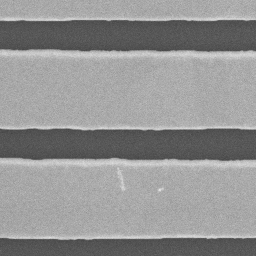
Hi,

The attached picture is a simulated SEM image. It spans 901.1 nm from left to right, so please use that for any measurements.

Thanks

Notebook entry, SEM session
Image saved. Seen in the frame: lines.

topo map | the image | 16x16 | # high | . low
################
................
................
################
################
################
################
################
................
................
################
################
################
################
################
................